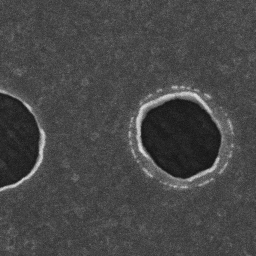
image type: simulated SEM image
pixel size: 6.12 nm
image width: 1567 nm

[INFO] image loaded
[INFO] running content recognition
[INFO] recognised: holes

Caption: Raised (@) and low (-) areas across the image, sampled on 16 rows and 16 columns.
@@@@@@@@@@@@@@@@
@@@@@@@@@@@@@@@@
@@@@@@@@@@@@@@@@
@@@@@@@@@@@@@@@@
@@@@@@@@@@@@@@@@
@@@@@@@@@@@@@@@@
-@@@@@@@@@---@@@
--@@@@@@@----@@@
---@@@@@@-----@@
--@@@@@@@-----@@
--@@@@@@@@---@@@
-@@@@@@@@@@@@@@@
@@@@@@@@@@@@@@@@
@@@@@@@@@@@@@@@@
@@@@@@@@@@@@@@@@
@@@@@@@@@@@@@@@@